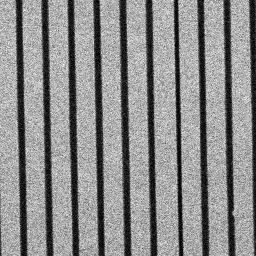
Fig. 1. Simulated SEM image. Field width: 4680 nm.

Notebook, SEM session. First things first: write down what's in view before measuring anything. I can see parallel lines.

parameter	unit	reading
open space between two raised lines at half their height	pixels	6.25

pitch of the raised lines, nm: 474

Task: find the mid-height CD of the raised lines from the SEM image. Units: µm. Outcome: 0.356